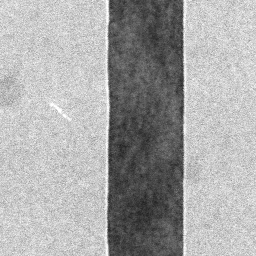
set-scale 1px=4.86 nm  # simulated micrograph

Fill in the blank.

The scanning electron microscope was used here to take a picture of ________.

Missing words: one or a few lines or trenches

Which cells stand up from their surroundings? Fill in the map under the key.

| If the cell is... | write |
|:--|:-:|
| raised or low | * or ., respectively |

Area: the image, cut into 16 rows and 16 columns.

*******.....****
*******.....****
*******.....****
*******.....****
*******.....****
*******.....****
*******....*****
*******.....****
*******.....****
*******.....****
*******.....****
*******.....****
*******.....****
*******.....****
*******....*****
*******....*****